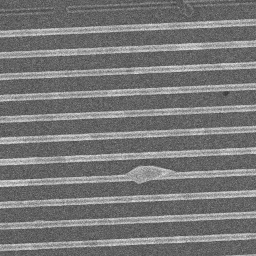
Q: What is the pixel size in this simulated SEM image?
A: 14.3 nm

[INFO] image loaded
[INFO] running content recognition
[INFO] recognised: parallel lines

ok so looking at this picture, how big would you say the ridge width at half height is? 62.7 nanometres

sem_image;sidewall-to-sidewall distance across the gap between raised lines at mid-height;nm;249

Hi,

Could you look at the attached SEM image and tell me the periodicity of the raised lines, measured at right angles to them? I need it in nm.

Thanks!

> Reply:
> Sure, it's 306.